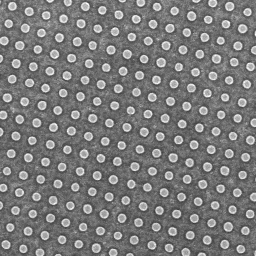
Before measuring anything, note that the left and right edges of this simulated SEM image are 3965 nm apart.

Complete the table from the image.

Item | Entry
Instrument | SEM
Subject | a regular array of raised bodies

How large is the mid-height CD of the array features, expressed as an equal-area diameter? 127 nanometres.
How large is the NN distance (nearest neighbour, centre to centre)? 17.1 px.